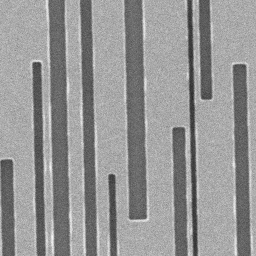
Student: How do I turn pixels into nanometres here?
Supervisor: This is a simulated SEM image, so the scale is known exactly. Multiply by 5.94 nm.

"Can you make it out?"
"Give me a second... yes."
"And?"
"groups of lines, slits or small figures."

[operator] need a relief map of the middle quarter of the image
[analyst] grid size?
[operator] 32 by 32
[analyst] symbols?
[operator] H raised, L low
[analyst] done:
LHHHLLLHHHHHHHHLLLLLHHHHHHHHHHHL
LHHHLLLLHHHHHHHLLLLLHHHHHHHHHHHL
LHHHLLLLHHHHHHHLLLLLHHHHHHHHHHHL
LHHHLLLLHHHHHHHLLLLLHHHHHHHHHHHL
LHHHLLLLHHHHHHHLLLLLHHHHHHHHHHHL
LHHHLLLLHHHHHHHLLLLLHHHHHHHHHHHL
LHHHLLLLHHHHHHHLLLLLHHHHHHHHHHHL
LHHHLLLLHHHHHHHLLLLLHHHHHHHHHHHL
LHHHLLLLHHHHHHHLLLLLHHHHHHHHHHHL
LHHHLLLLHHHHHHHLLLLLHHHHHHHHHHHL
LHHHLLLLHHHHHHHLLLLLHHHHHHHHHHHL
LHHHLLLLHHHHHHHHLLLLHHHHHHHHHHHL
LHHHLLLLHHHHHHHHLLLLHHHHHHHHHHHL
LHHHLLLLHHHHHHHHLLLLLHHHHHHHHHHL
LHHHLLLLHHHHHHHHLLLLLHHHHHHHHHHL
LHHHLLLLHHHHHHHHLLLLLHHHHHHHHHHL
LHHHHLLLHHHHHHHHLLLLLHHHHHHLLLLL
LHHHHLLLHHHHHHHHLLLLLHHHHHHLLLLL
LHHHHLLLHHHHHHHHLLLLLHHHHHHLLLLL
LHHHHLLLHHHHHHHHLLLLLHHHHHHLLLLL
LHHHHLLLHHHHHHHHLLLLLHHHHHHLLLLL
LHHHHLLLHHHHHHHHLLLLLHHHHHHLLLLL
LHHHHLLLHHHHHHHHLLLLLHHHHHHLLLLL
LHHHHLLLHHHHHHHHLLLLLHHHHHHLLLLL
LHHHHLLLHHHHHHHHLLLLLHHHHHHLLLLL
LHHHHLLLHHHHHHHHLLLLLHHHHHHLLLLL
LHHHHLLLHHHHHHHHLLLLLHHHHHHLLLLL
LHHHHLLLHHHHHHHHLLLLLHHHHHHLLLLH
LHHHHLLLHHHLLHHHLLLLLHHHHHHLLLLH
LHHHHLLLHHHLLHHHLLLLLHHHHHHLLLLH
LHHHHLLLHHHLLHHHLLLLLHHHHHHLLLLH
LLHHHLLLHHHLLHHHLLLLLHHHHHHLLLLH